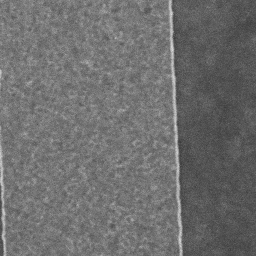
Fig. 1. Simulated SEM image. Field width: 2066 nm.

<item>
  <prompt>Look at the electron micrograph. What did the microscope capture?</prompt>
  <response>one or a few lines or trenches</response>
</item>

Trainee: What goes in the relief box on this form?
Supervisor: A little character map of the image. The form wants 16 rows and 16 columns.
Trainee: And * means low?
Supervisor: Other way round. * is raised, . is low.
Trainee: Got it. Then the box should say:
***********.....
***********.....
***********.....
***********.....
***********.....
***********.....
***********.....
***********.....
***********.....
***********.....
***********.....
***********.....
***********.....
***********.....
***********.....
***********.....